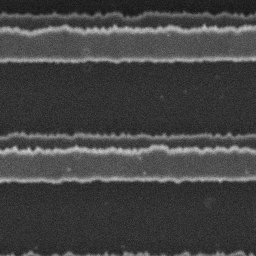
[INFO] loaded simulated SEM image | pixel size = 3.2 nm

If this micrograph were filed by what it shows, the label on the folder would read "lines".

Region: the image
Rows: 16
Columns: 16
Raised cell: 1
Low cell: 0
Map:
0000000000000000
1111111111111111
1111111111111111
1111111111111111
0000000000000000
0000000000000000
0000000000000000
0000000000000000
0111010000011111
1111111111111111
1111111111111111
0000000000000000
0000000000000000
0000000000000000
0000000000000000
0000000000000000